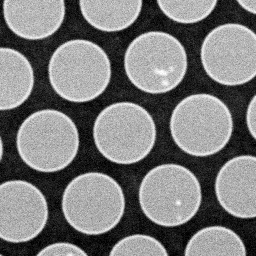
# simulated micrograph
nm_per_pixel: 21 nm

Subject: an array of small figures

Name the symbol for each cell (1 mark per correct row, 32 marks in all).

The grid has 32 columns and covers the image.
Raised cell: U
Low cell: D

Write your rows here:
DUUUUUUUDDUUUUUUUUDDUUUUUUUDDDUU
DUUUUUUUDDUUUUUUUDDDDUUUUUDDDDDU
DUUUUUUUDDDUUUUUUDDDDDUUUDDDDDDD
DUUUUUUDDDDDUUUUDDDDDDDDDDDUUUUD
DDDUUUDDDDDDDDDDDDUUUDDDDDUUUUUU
DDDDDDDDUUUUDDDDUUUUUUUDDUUUUUUU
UUDDDDDUUUUUUDDDUUUUUUUDDUUUUUUU
UUUDDDUUUUUUUDDDUUUUUUUDDUUUUUUU
UUUUDDUUUUUUUUDDUUUUUUUDDDUUUUUU
UUUUDDUUUUUUUUDDUUUUUUUDDDUUUUUU
UUUUDDUUUUUUUDDDDUUUUUDDDDDDUUDD
UUUUDDDUUUUUUDDDDDDUDDDDDDDDDDDD
UUUDDDDDDUUDDDDDDDDDDDDUUUUDDDDD
UDDDDDDDDDDDDUUUUUDDDDUUUUUUDDDU
DDDDUUUUDDDDUUUUUUUDDDUUUUUUUDDU
DDDUUUUUUDDDUUUUUUUDDUUUUUUUUDDU
DDUUUUUUUUDDUUUUUUUDDUUUUUUUUDDU
DDUUUUUUUUDDUUUUUUUDDDUUUUUUUDDD
DDUUUUUUUUDDUUUUUUUDDDDUUUUUDDDD
DDDUUUUUUDDDDUUUUUDDDDDDDDDDDDDD
DDDUUUUUDDDDDDDDDDDDDDDDDDDDUUUU
DDDDDDDDDDDDDDDDDDDUUUUUDDDDUUUU
DDDDDDDDDUUUUUDDDDUUUUUUUDDUUUUU
UUUUDDDDUUUUUUUDDDUUUUUUUDDUUUUU
UUUUUDDDUUUUUUUDDUUUUUUUUDDUUUUU
UUUUUUDDUUUUUUUDDDUUUUUUUDDDUUUU
UUUUUUDDUUUUUUUDDDUUUUUUDDDDDUUU
UUUUUUDDUUUUUUUDDDDUUUUDDDDDDDDD
UUUUUDDDDUUUUUDDDDDDDDDDDDUUDDDD
UUUUDDDDDDDDDDDDUUDDDDDDUUUUUUDD
DDDDDDDUDDDDDDDUUUUUDDDDUUUUUUDD
DDDDDUUUUUDDDDUUUUUUUDDUUUUUUUUD